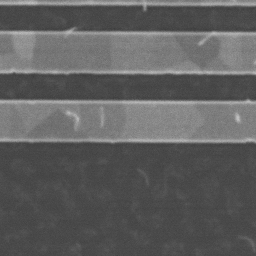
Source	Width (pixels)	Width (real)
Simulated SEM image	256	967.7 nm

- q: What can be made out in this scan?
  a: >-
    one or a few lines or trenches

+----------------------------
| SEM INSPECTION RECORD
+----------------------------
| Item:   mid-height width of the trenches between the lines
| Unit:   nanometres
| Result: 110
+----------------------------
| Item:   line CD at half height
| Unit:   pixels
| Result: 39.3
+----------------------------